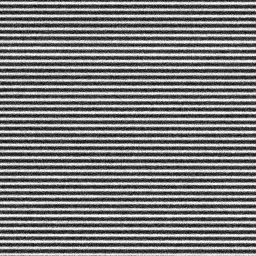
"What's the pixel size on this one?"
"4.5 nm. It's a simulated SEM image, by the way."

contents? parallel lines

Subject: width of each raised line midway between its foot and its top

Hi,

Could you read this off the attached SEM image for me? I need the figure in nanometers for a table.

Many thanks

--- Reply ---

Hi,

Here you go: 9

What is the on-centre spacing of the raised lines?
0.029 um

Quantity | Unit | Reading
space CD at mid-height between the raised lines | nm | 21.9